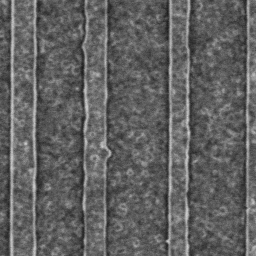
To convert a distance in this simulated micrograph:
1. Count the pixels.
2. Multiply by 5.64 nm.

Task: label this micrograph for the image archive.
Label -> one or a few lines or trenches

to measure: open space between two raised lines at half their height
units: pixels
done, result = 59.7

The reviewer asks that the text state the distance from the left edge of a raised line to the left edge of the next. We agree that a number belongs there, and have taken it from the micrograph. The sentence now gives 438 nm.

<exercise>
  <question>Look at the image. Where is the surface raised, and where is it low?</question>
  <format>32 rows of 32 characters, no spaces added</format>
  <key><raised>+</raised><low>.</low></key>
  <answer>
..++.......++........+++.......+
..++.......++........+++.......+
..++.......++........+++.......+
.+++.......++........+++.......+
.+++.......++........++........+
.+++......+++........++........+
.+++.......++........+++.......+
.+++.......++........+++.......+
.+++.......++........+++.......+
.+++.......++........+++.......+
.+++.......++........+++.......+
..++.......++........++........+
..++.......++........++........+
.+++.......++........++........+
.+++.......++........++........+
.+++.......++........++........+
.+++.......++........+++.......+
.+++.......++........+++.......+
.+++.......++........++........+
.+++.......+++.......++........+
.+++.......++........++........+
.+++.......++........++........+
.+++.......++........++........+
.+++......+++........++........+
.+++......+++........++........+
.+++......+++........++........+
.+++.......++........++........+
.+++.......++........++........+
.+++.......++........++........+
.+++.......++........++........+
.+++.......++........+++.......+
.+++.......++........++........+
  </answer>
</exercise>